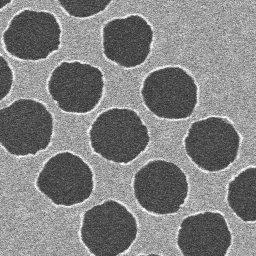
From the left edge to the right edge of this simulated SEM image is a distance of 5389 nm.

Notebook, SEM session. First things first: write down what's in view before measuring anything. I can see a regular array of holes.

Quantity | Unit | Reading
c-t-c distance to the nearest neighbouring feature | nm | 1390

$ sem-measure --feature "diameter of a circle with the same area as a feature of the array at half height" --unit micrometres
1.14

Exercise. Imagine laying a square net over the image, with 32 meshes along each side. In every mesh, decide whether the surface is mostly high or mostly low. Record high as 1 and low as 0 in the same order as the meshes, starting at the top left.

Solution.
01111110000000111111111111111111
11100111000011111111111111111111
10000001111111000011111111111111
10000001111110000001111111111111
00000001111110000001111111111111
10000001111110000001111111111111
10000001111110000001111111111111
01110111111111000011111111111111
01111110000011111111101111111111
00111100000001111110000011111111
00111100000001111100000011111111
01111100000001111100000001111111
11001110000011111100000001111111
10000011000011111100000011111111
00000011111100000111000011111111
00000001111100000011111100000111
00000011111000000011111000000011
00000011111000000001111000000011
10000011111100000011111000000011
11111110001110000111111100000011
11111100000111111100001100000111
11111000000011111000000111111100
11111000000011111000000111111000
11111000000011111000000011111000
11111100000111111000000111110000
11111110011110011000000111111000
11111111111000001110001111111000
11111111110000000111111000001100
11111111110000000111110000000111
11111111110000000111110000000111
11111111111000001111110000000111
11111111111000011111111000001111